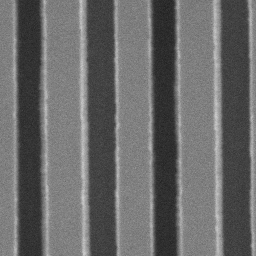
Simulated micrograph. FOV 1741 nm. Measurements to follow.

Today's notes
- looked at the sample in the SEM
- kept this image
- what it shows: lines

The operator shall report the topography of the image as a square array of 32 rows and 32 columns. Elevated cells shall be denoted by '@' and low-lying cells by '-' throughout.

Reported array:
@@---@@@@@-----@@@@---@@@@@----@
@@---@@@@@----@@@@@---@@@@@----@
@@----@@@@----@@@@@---@@@@@----@
@@----@@@@-----@@@@---@@@@@----@
@@----@@@@-----@@@@---@@@@@----@
@@----@@@@-----@@@@---@@@@@----@
@@----@@@@-----@@@@---@@@@@----@
@@----@@@@-----@@@@---@@@@@----@
@@---@@@@@-----@@@@---@@@@@----@
@@----@@@@-----@@@@---@@@@@----@
@@---@@@@@-----@@@@---@@@@@----@
@@----@@@@-----@@@@---@@@@@----@
@@----@@@@-----@@@@---@@@@@----@
@@----@@@@-----@@@@---@@@@@----@
@@----@@@@-----@@@@---@@@@@----@
@@----@@@@@----@@@@---@@@@@----@
@@----@@@@-----@@@@---@@@@@----@
@@----@@@@@----@@@@---@@@@@-----
@@----@@@@@----@@@@---@@@@@----@
@@----@@@@@----@@@@---@@@@@----@
@@----@@@@@----@@@@---@@@@@-----
@@----@@@@@----@@@@---@@@@@----@
@@----@@@@@----@@@@---@@@@@-----
@@----@@@@@----@@@@---@@@@@-----
@@----@@@@@----@@@@---@@@@@-----
@@----@@@@@----@@@@---@@@@@-----
@@----@@@@@----@@@@---@@@@@-----
@@----@@@@@----@@@@---@@@@@-----
@@----@@@@@----@@@@---@@@@@-----
@@----@@@@@----@@@@----@@@@-----
@@----@@@@@----@@@@----@@@@-----
@@----@@@@@----@@@@----@@@@-----